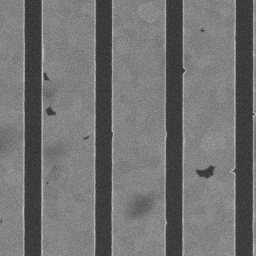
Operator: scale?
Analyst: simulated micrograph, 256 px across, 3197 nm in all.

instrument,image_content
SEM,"one or a few lines or trenches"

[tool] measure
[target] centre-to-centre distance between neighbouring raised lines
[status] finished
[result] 869 nanometers